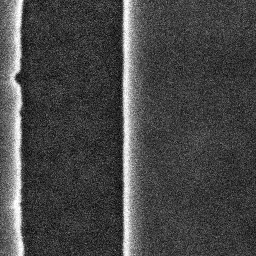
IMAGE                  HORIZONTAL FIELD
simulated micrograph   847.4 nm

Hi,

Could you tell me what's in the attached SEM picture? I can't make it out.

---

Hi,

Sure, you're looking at one or a few lines or trenches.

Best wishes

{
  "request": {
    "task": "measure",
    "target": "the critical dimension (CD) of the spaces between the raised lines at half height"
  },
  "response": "0.354 microns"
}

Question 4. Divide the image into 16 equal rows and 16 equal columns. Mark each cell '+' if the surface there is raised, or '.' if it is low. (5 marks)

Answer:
+.......++++++++
+.......++++++++
+.......++++++++
+.......++++++++
+.......++++++++
+.......++++++++
+.......++++++++
+.......++++++++
+.......++++++++
+.......++++++++
+.......++++++++
+.......++++++++
+.......++++++++
+.......++++++++
+.......++++++++
+.......++++++++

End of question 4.